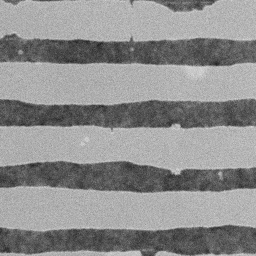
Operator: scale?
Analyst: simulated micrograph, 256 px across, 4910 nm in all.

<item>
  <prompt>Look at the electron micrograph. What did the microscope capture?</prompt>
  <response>one or a few lines or trenches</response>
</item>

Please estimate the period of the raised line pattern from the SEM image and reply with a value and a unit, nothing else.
1.2 µm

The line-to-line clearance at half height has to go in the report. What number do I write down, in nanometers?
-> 477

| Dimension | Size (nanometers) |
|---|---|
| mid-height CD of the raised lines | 717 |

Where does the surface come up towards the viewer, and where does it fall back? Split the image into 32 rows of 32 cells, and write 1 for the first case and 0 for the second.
10111111111111111111000000011111
11111111111111111111110011111111
11111111111111111111111111111111
11111111111111111111111111111111
00111111111111111111111111111111
00000000000000000000000000000000
00000000000000000000000000000000
00000000000000000000000000000000
11111111111111111111111111111111
11111111111111111111111111111111
11111111111111111111111111111111
11111111111111111111111111111111
00111111111111111110111111111000
00000000000000000000000000000000
00000000000000000000000000000000
00000000000000000000000000000000
11111111111111111111111111111111
11111111111111111111111111111111
11111111111111111111111111111111
11111111111111111111111111111111
11100000000000000111111111111111
00000000000000000000000000000000
00000000000000000000000000000000
01111110000000000000000000000000
11111111111111111111111111111111
11111111111111111111111111111111
11111111111111111111111111111111
11111111111111111111111111111111
01111111111111111111110000000000
00000000000000000000000000000000
00000000000000000000000000000000
00000000001100001000100000000000